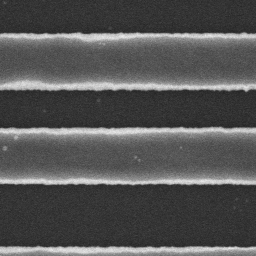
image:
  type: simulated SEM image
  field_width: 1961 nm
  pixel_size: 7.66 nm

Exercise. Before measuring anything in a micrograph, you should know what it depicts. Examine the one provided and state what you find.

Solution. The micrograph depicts lines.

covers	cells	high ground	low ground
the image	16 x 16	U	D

DDDDDDDDDDDDDDDD
DDDDDDDDDDDDDDDD
UUUUUUUUUUUUUUUU
UUUUUUUUUUUUUUUU
UUUUUUUUUUUUUUUU
UUUUUUUUUUUUUUUU
DDDDDDDDDDDDDDDD
DDDDDDDDDDDDDDDD
UUUUUUUUUUUUUUUU
UUUUUUUUUUUUUUUU
UUUUUUUUUUUUUUUU
DDDDDDDDUDDDDDDD
DDDDDDDDDDDDDDDD
DDDDDDDDDDDDDDDD
DDDDDDDDDDDDDDDD
UUUUUDUUUUUUUUUU